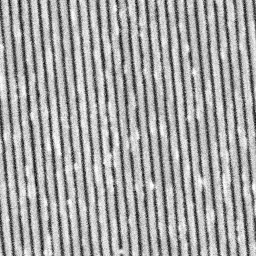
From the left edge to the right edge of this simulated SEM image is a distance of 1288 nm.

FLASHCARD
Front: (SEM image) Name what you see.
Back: parallel lines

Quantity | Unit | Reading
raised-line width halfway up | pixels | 5.61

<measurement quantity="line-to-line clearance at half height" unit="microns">0.0188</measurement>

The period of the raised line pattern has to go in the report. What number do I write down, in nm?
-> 49